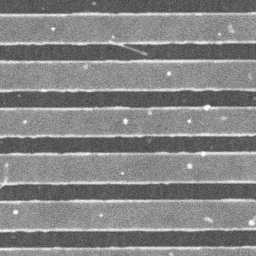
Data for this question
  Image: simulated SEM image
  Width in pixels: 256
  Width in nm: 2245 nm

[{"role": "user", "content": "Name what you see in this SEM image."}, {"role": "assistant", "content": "lines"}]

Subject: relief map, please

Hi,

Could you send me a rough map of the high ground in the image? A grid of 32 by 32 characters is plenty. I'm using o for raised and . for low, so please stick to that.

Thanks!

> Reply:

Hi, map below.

................................
................................
oooooooooooooooooooooooooooooooo
oooooooooooooooooooooooooooooooo
oooooooooooooooooooooooooooooooo
oooooo...oo...oo................
................................
................................
oooooooooooooooooooooooooooooooo
oooooooooooooooooooooooooooooooo
oooooooooooooooooooooooooooooooo
................................
................................
..............oo....oooooooooooo
oooooooooooooooooooooooooooooooo
oooooooooooooooooooooooooooooooo
oooooooooooooooooooooooooooooooo
................................
................................
oooooooooooooooooooooooooooooooo
oooooooooooooooooooooooooooooooo
oooooooooooooooooooooooooooooooo
oooooooooooooooooooooooooooooooo
................................
................................
oooooooooooooooooooooooooooooooo
oooooooooooooooooooooooooooooooo
oooooooooooooooooooooooooooooooo
oooooooooooooooooooooooooooooooo
................................
................................
oooooooooooooooooooooooooooooooo